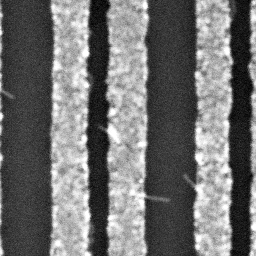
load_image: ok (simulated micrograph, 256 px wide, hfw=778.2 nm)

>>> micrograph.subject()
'lines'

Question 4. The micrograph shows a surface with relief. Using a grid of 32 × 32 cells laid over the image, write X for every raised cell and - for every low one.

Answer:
-------XXXX---XXXX------XXXXX---
-------XXXX---XXXX-------XXXX--X
-------XXXX--XXXXX-------XXXX--X
-------XXXX---XXXX-------XXXX--X
-------XXXX---XXXX-------XXXX---
-------XXXX---XXXX-------XXXX--X
-------XXXX---XXXX-------XXXX--X
-------XXXX---XXXX-------XXXX---
-------XXXX---XXXX-------XXXX--X
-------XXXX--XXXXX------XXXXX--X
-------XXXX--XXXXX-------XXXX---
-------XXXX--XXXXX-------XXXX---
-------XXXX---XXXX-------XXXX---
-------XXXX---XXXX-------XXXX---
-------XXXX---XXXX-------XXXX---
-------XXXX---XXXX-------XXX----
------XXXXX---XXXX-------XXX----
------XXXXX---XXXX-------XXX----
-------XXXX---XXXX-------XXX----
------XXXXX--XXXXX-------XXX---X
-------XXXX---XXXX-------XXX----
-------XXXX---XXXX-------XXXX---
-------XXXX---XXXX-------XXXX---
-------XXXX---XXXX-------XXXX---
-------XXXX---XXXX-------XXXX---
-------XXXX---XXXX------XXXXX--X
-------XXXX---XXXX------XXXX---X
-------XXXX---XXXX------XXXXX--X
-------XXXX--XXXXX------XXXXX--X
-------XXXX---XXXX------XXXXX---
------XXXXX---XXXX------XXXXX--X
------XXXXX---XXXX-------XXXX--X